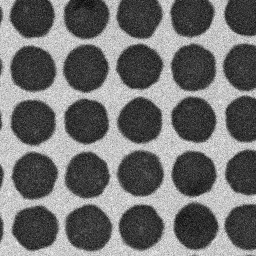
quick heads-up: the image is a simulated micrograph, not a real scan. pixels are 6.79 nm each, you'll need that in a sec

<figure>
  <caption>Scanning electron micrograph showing a regular array of holes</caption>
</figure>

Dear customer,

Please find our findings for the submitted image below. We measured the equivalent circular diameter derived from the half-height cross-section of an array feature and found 310 nanometres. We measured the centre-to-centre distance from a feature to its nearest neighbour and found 357 nanometers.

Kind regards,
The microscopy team